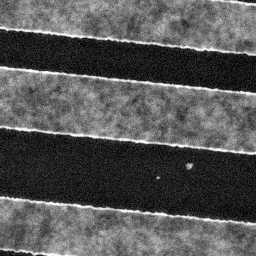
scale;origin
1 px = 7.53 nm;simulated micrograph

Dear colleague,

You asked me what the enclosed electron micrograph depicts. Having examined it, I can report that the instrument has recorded lines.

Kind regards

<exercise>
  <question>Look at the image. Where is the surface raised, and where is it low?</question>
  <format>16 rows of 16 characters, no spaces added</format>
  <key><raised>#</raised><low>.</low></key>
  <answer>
################
################
.......#########
................
###.............
#############...
################
################
.....###########
...............#
................
................
##..............
###########.....
################
################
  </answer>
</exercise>